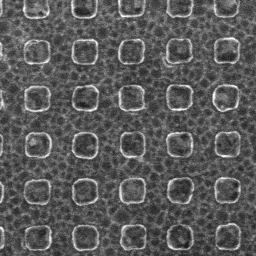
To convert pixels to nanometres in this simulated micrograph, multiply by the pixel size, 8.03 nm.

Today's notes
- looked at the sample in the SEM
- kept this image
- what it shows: a regular array of raised bodies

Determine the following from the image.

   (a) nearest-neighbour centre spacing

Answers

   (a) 371 nm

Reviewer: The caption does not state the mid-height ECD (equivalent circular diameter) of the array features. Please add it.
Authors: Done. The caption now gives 0.214 µm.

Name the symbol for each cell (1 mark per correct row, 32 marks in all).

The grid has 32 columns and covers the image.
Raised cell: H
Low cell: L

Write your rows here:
LLLHHHLLLHHHLLLHHHLLLHHHLLLHHHLL
LLLHHHLLLHHHLLLHHHLLLHHHLLLHHHLL
LLLLLLLLLLLLLLLLLLLLLLLLLLLLLLLL
LLLLLLLLLLLLLLLLLLLLLLLLLLLLLLLL
LLLLLLLLLLLLLLLLLLLLLLLLLLLLLLLL
LLLHHHLLLHHHLLLHHHLLLHHHLLLHHHLL
LLLHHHLLLHHHLLLHHHLLLHHHLLLHHHLL
LLLHHHLLLHHHLLLHHHLLLHHHLLLHHHLL
LLLLLLLLLLLLLLLLLLLLLLLLLLLLLLLL
LLLLLLLLLLLLLLLLLLLLLLLLLLLLLLLL
LLLLLLLLLLLLLLLLLLLLLLLLLLLLLLLL
LLLHHHLLLHHHLLLHHHLLLHHHLLLHHHLL
LLLHHHLLLHHHLLLHHHLLLHHHLLLHHHLL
LLLHHHLLLHHHLLLHHHLLLHHLLLLHHLLL
LLLLLLLLLLLLLLLLLLLLLLLLLLLLLLLL
LLLLLLLLLLLLLLLLLLLLLLLLLLLLLLLL
LLLLLLLLLLLLLLLLLLLLLLLLLLLLLLLL
LLLHHHLLLHHHLLLHHHLLLHHHLLLHHHLL
LLLHHHLLLHHHLLLHHHLLLHHHLLLHHHLL
LLLLHHLLLLHHLLLLHHLLLLHHLLLLHHLL
LLLLLLLLLLLLLLLLLLLLLLLLLLLLLLLL
LLLLLLLLLLLLLLLLLLLLLLLLLLLLLLLL
LLLLHHLLLLHLLLLLHHLLLLHHLLLHHHLL
LLLHHHLLLHHHLLLHHHLLLHHHLLLHHHLL
LLLHHHLLLHHHLLLHHHLLLHHHLLLHHHLL
LLLLLLLLLLHLLLLLLLLLLLLLLLLLLLLL
LLLLLLLLLLLLLLLLLLLLLLLLLLLLLLLL
LLLLLLLLLLLLLLLLLLLLLLLLLLLLLLLL
LLLLHHLLLHHHLLLLHHLLLHHHLLLHHHLL
LLLHHHLLLHHHLLLHHHLLLHHHLLLHHHLL
LLLHHHLLLHHHLLLHHHLLLHHHLLLHHHLL
LLLLLLLLLLLLLLLLLLLLLLLLLLLLLLLL